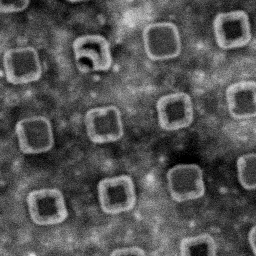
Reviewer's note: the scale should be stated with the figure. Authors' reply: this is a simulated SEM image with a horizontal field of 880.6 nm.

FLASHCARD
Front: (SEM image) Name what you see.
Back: a regular array of raised bodies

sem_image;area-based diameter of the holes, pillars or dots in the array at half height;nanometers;126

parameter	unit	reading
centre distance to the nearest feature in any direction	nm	242